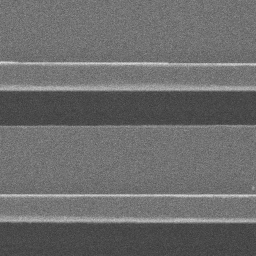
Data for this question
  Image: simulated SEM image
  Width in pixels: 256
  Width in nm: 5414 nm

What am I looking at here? lines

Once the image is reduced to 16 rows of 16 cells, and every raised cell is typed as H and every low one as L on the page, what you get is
HHHHHHHHHHHHHHHH
HHHHHHHHHHHHHHHH
HHHHHHHHHHHHHHHH
HHHHHHHHHHHHHHHH
HHHHHHHHHHHHHHHH
HHHHHHHHHHHHHHHH
LLLLLLLLLLLLLLLL
LLLLLLLLLLLLLLLL
HHHHHHHHHHHHHHHH
HHHHHHHHHHHHHHHH
HHHHHHHHHHHHHHHH
HHHHHHHHHHHHHHHH
HHHHHHHHHHHHHHHH
HHHHHHHHHHHHHHHH
LLLLLLLLLLLLLLLL
LLLLLLLLLLLLLLLL